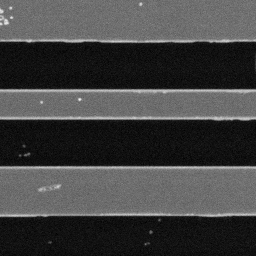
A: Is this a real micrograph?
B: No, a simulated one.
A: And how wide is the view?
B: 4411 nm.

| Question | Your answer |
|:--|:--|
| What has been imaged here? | lines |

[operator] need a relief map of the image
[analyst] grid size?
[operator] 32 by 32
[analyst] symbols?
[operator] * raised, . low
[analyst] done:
********************************
********************************
********************************
********************************
********************************
................................
................................
................................
................................
................................
................................
********************************
********************************
********************************
********************************
................................
................................
................................
................................
................................
................................
********************************
********************************
********************************
********************************
********************************
********************************
................................
................................
................................
................................
................................